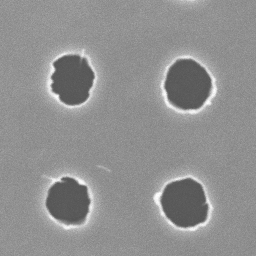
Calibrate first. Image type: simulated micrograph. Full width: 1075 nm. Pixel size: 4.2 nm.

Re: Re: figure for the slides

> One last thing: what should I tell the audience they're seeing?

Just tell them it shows holes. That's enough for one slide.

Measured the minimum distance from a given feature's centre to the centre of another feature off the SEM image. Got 486 nanometers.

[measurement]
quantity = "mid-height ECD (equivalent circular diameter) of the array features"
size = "0.196 micrometres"